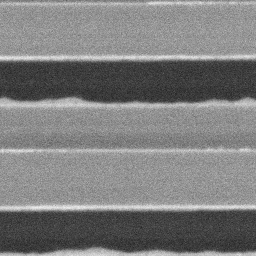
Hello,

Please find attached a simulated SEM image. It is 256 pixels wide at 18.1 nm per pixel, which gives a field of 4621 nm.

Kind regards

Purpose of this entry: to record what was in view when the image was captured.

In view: lines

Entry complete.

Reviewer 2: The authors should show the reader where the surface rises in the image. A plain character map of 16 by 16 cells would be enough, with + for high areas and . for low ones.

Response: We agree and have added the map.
++++++++++++++++
++++++++++++++++
++++++++++++++++
++++++++++++++++
................
................
+.++++.......+++
++++++++++++++++
++++++++++++++++
++++++++++++++++
++++++++++++++++
++++++++++++++++
++++++++++++++++
................
................
................